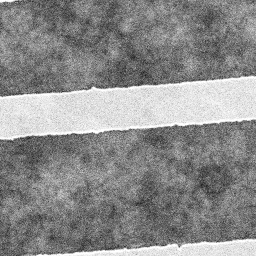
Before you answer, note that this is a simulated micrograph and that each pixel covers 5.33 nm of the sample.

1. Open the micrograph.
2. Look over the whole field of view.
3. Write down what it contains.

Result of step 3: one or a few lines or trenches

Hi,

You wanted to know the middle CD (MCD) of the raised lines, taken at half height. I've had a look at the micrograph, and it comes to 41 pixels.